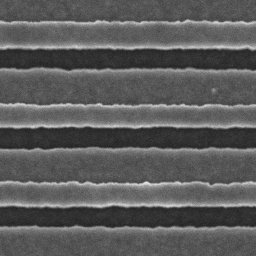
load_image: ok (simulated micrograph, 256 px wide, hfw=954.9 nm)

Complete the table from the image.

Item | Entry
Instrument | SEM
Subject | lines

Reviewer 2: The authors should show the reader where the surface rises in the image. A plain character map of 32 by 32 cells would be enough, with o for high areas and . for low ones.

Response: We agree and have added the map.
oooooooooooooooooooooooooooooooo
oooooooooooooooooooooooooooooooo
oooooooooooooooooooooooooooooooo
oooooooooooooooooooooooooooooooo
oooooooooooooooooooooooooooooooo
oooooooooooooooooooooooooooooooo
................................
................................
................................
oooooooooooooooooooooooooooooooo
oooooooooooooooooooooooooooooooo
oooooooooooooooooooooooooooooooo
oooooooooooooooooooooooooooooooo
oooooooooooooooooooooooooooooooo
oooooooooooooooooooooooooooooooo
oooooooooooooooooooooooooooooooo
................................
................................
................................
oooooooooooooooooooooooooooooooo
oooooooooooooooooooooooooooooooo
oooooooooooooooooooooooooooooooo
oooooooooooooooooooooooooooooooo
oooooooooooooooooooooooooooooooo
oooooooooooooooooooooooooooooooo
oooooooooooooooooooooooooooooooo
................................
................................
ooooooo.oooooo.ooo...ooo.o.ooooo
oooooooooooooooooooooooooooooooo
oooooooooooooooooooooooooooooooo
oooooooooooooooooooooooooooooooo